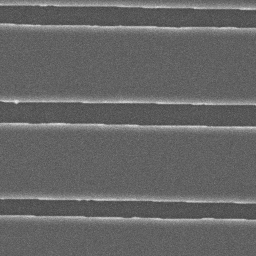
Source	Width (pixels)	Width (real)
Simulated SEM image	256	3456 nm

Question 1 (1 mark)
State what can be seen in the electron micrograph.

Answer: lines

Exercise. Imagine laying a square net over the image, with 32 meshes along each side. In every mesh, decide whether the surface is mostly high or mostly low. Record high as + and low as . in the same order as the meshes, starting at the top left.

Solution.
++++++++++++++++++++++++++++++++
................................
................................
++++++++++++++++++++++++++++++..
++++++++++++++++++++++++++++++++
++++++++++++++++++++++++++++++++
++++++++++++++++++++++++++++++++
++++++++++++++++++++++++++++++++
++++++++++++++++++++++++++++++++
++++++++++++++++++++++++++++++++
++++++++++++++++++++++++++++++++
++++++++++++++++++++++++++++++++
++++++++++++++++++++++++++++++++
................................
................................
++++..+++.......................
++++++++++++++++++++++++++++++++
++++++++++++++++++++++++++++++++
++++++++++++++++++++++++++++++++
++++++++++++++++++++++++++++++++
++++++++++++++++++++++++++++++++
++++++++++++++++++++++++++++++++
++++++++++++++++++++++++++++++++
++++++++++++++++++++++++++++++++
++++++++++++++++++++++++++++++++
................................
................................
+++++++++++++++++++++++++++++++.
++++++++++++++++++++++++++++++++
++++++++++++++++++++++++++++++++
++++++++++++++++++++++++++++++++
++++++++++++++++++++++++++++++++